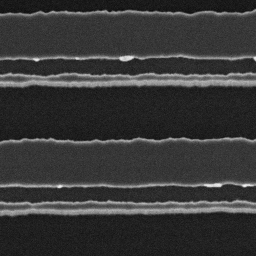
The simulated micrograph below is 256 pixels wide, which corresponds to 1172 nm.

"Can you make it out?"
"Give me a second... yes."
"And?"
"lines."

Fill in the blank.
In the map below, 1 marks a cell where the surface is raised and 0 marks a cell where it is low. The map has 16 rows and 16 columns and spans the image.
0000000000000000
1111111111111111
1111111111111111
1111111111111111
1111111111111111
0000000000000000
0000000000000000
0000000000000000
0000000000000000
1111111111111111
1111111111111111
1111111111111111
1111111111111111
0000000000000000
0000000000000000
0000000000000000